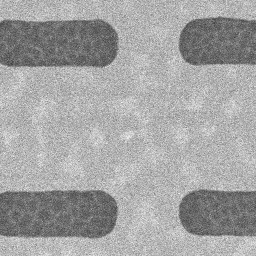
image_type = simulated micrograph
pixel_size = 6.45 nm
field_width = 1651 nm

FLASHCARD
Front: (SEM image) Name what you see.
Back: holes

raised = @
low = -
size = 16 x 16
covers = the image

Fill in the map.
@@@@@@@@@@@@@@@@
-------@@@@@----
-------@@@@-----
-------@@@@-----
@@@@@@@@@@@@@@@@
@@@@@@@@@@@@@@@@
@@@@@@@@@@@@@@@@
@@@@@@@@@@@@@@@@
@@@@@@@@@@@@@@@@
@@@@@@@@@@@@@@@@
@@@@@@@@@@@@@@@@
@@@@@@@@@@@@@@@@
-------@@@@-----
-------@@@@-----
-------@@@@@----
@@@@@@@@@@@@@@@@